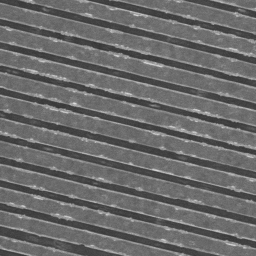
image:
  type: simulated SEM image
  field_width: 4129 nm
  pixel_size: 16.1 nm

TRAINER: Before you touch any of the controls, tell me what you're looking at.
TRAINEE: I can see parallel lines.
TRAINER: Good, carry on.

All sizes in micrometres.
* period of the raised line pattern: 0.361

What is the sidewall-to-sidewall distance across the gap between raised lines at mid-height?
110 nanometres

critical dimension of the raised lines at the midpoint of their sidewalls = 0.247 micrometres